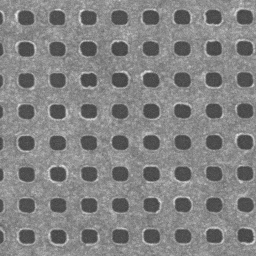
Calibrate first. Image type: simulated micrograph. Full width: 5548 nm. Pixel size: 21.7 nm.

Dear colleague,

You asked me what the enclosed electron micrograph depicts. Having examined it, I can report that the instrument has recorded a regular array of holes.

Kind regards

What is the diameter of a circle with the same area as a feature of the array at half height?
0.37 microns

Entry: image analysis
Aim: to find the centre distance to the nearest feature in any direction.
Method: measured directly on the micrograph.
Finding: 672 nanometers